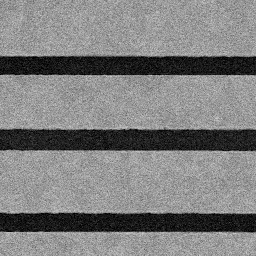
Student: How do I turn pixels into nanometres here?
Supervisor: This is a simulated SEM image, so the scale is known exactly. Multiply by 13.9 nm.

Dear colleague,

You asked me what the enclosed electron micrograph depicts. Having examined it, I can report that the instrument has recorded lines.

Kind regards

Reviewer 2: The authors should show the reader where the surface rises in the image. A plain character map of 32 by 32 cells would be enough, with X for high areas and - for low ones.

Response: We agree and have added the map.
XXXXXXXXXXXXXXXXXXXXXXXXXXXXXXXX
XXXXXXXXXXXXXXXXXXXXXXXXXXXXXXXX
XXXXXXXXXXXXXXXXXXXXXXXXXXXXXXXX
XXXXXXXXXXXXXXXXXXXXXXXXXXXXXXXX
XXXXXXXXXXXXXXXXXXXXXXXXXXXXXXXX
XXXXXXXXXXXXXXXXXXXXXXXXXXXXXXXX
XXXXXXXXXXXXXXXXXXXXXXXXXXXXXXXX
--------------------------------
--------------------------------
XXXXXXXXXXXXXXXXXXXXXXXXXXXXXXXX
XXXXXXXXXXXXXXXXXXXXXXXXXXXXXXXX
XXXXXXXXXXXXXXXXXXXXXXXXXXXXXXXX
XXXXXXXXXXXXXXXXXXXXXXXXXXXXXXXX
XXXXXXXXXXXXXXXXXXXXXXXXXXXXXXXX
XXXXXXXXXXXXXXXXXXXXXXXXXXXXXXXX
XXXXXXXXXXXXXXXXXXXXXXXXXXXXXXXX
--------------------------------
--------------------------------
--------------------------------
XXXXXXXXXXXXXXXXXXXXXXXXXXXXXXXX
XXXXXXXXXXXXXXXXXXXXXXXXXXXXXXXX
XXXXXXXXXXXXXXXXXXXXXXXXXXXXXXXX
XXXXXXXXXXXXXXXXXXXXXXXXXXXXXXXX
XXXXXXXXXXXXXXXXXXXXXXXXXXXXXXXX
XXXXXXXXXXXXXXXXXXXXXXXXXXXXXXXX
XXXXXXXXXXXXXXXXXXXXXXXXXXXXXXXX
XXXXXXXXXXXXXXXXXXXXXXXXXXXXXXXX
--------------------------------
--------------------------------
XXXXXXXXXXXXXXXXXXXXXXXXXXXXXXXX
XXXXXXXXXXXXXXXXXXXXXXXXXXXXXXXX
XXXXXXXXXXXXXXXXXXXXXXXXXXXXXXXX